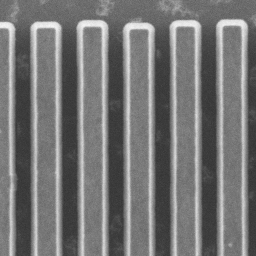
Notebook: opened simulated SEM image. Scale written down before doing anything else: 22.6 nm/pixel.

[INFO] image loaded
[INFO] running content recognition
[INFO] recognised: parallel lines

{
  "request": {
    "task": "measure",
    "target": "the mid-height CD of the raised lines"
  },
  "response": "600 nanometres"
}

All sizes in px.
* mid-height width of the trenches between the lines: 19.6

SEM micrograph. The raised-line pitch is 1050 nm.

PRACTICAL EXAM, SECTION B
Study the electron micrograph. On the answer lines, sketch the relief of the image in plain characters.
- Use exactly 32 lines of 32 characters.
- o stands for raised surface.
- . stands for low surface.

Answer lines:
................................
................................
................................
o...ooo...ooo...ooo...ooo..oooo.
oo..ooo...ooo...ooo...ooo..oooo.
oo..ooo...ooo...ooo...ooo..oooo.
oo..ooo...ooo...ooo...ooo..oooo.
oo..ooo...ooo...ooo...ooo..oooo.
oo..ooo...ooo...ooo...ooo..oooo.
oo..ooo...ooo...ooo...ooo..oooo.
oo..ooo...ooo...ooo...ooo..oooo.
oo..ooo...ooo...ooo...ooo..oooo.
oo..ooo...ooo...ooo...ooo..oooo.
oo..ooo...ooo...ooo...ooo..oooo.
oo..ooo...ooo...ooo...ooo..oooo.
oo..ooo...ooo...ooo...ooo..oooo.
oo..ooo...ooo...ooo...ooo..oooo.
oo..ooo...ooo...ooo...ooo..oooo.
oo..ooo...ooo...ooo...ooo..oooo.
oo..ooo...ooo...ooo...ooo..oooo.
oo..ooo...ooo...ooo...ooo..oooo.
oo..ooo...ooo...ooo...ooo..oooo.
oo..ooo...ooo...ooo...ooo..oooo.
oo..ooo...ooo...ooo...ooo..oooo.
oo..ooo...ooo...ooo...ooo..oooo.
oo..ooo...ooo...ooo...ooo...ooo.
oo..ooo...ooo...ooo...ooo...ooo.
oo..ooo...ooo...ooo...ooo...ooo.
oo..ooo...ooo...ooo...ooo...ooo.
oo..ooo...ooo...ooo...ooo...ooo.
oo..ooo...ooo...ooo...ooo...ooo.
oo..ooo...ooo...ooo...ooo...ooo.